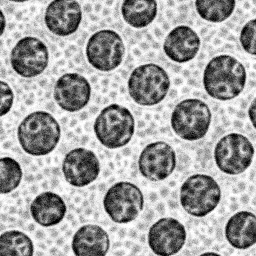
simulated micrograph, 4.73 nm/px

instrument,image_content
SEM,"a regular array of holes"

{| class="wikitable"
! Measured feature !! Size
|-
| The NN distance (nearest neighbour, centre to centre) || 251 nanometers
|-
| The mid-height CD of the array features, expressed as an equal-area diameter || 198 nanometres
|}